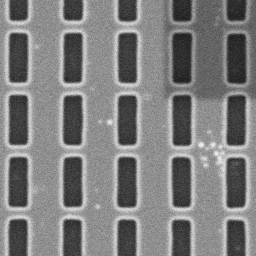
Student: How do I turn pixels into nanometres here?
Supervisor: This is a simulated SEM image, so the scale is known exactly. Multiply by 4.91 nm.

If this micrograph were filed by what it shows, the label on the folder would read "groups of lines, slits or small figures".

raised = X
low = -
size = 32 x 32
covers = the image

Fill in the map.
X---XXXX--XXXXX--XXXX---XXXX---X
X---XXXX--XXXXX--XXXX---XXXX---X
X--XXXXX--XXXXX--XXXXX--XXXXX-XX
XXXXXXXXXXXXXXXXXXXXXXXXXXXXXXXX
X--XXXXX--XXXXX--XXXXX--XXXXX--X
X---XXXX--XXXXX--XXXX---XXXX---X
X---XXXX--XXXXX--XXXX---XXXX---X
X---XXXX--XXXXX--XXXX---XXXX---X
X---XXXX--XXXXX--XXXX---XXXX---X
X---XXXX--XXXXX--XXXX---XXXX---X
XXXXXXXXXXXXXXXXXXXXXX-XXXXXX-XX
XXXXXXXXXXXXXXXXXXXXXXXXXXXXXXXX
X---XXXX--XXXXX--XXXXX--XXXX---X
X---XXXX--XXXXX--XXXX---XXXX---X
X---XXXX--XXXXX--XXXX---XXXX---X
X---XXXX--XXXXX--XXXX---XXXX---X
X---XXXX--XXXXX--XXXX---XXXX---X
X---XXXX--XXXXX--XXXX---XXXX---X
XXXXXXXXXXXXXXXXXXXXXXXXXXXXXXXX
XX-XXXXXX-XXXXX-XXXXXX-XXXXXXXXX
X---XXXX--XXXXX--XXXX---XXXX---X
X---XXXX--XXXXX--XXXX---XXXX---X
X---XXXX--XXXXX--XXXX---XXXX---X
X---XXXX--XXXXX--XXXX---XXXX---X
X---XXXX--XXXXX--XXXX---XXXX---X
X--XXXXX--XXXXX--XXXXX--XXXX---X
XXXXXXXXXXXXXXXXXXXXXXXXXXXXXXXX
X--XXXXX--XXXXX--XXXXX-XXXXXX-XX
X---XXXX--XXXXX--XXXX---XXXX---X
X---XXXX--XXXXX--XXXX---XXXX---X
X---XXXX--XXXXX--XXXX---XXXX---X
X---XXXX--XXXXX--XXXX---XXXX---X